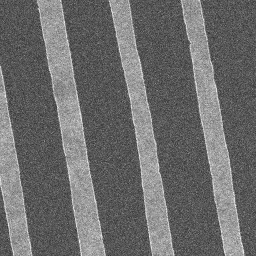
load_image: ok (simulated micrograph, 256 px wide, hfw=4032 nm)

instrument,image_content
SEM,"one or a few lines or trenches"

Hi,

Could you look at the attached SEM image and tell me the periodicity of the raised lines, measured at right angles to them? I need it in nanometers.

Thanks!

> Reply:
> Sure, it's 1100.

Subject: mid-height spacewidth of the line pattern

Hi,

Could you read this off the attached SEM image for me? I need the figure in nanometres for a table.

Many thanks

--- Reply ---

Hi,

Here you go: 780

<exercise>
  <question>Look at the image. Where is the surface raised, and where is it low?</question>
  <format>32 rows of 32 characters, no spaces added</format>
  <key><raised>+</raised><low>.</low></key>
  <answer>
.....+++......++.......++.......
.....+++......++.......++.......
.....+++......++.......++.......
.....+++......+++......+++......
.....+++.......++......+++......
......+++......++.......++......
......+++......++.......++......
......+++......++.......++......
......+++......+++......+++.....
......+++.......++......+++.....
.......++.......++......+++.....
+......+++......++.......++.....
+......+++......++.......++.....
+......+++......+++......++.....
+......+++.......++......+++....
+.......++.......++......+++....
++......++.......++.......++....
++......+++......++.......++....
++......+++......+++......++....
++......+++......+++......+++...
++......+++.......++......+++...
++.......++.......++......+++...
+++......++.......++.......++...
+++......+++......++.......++...
+++......+++......++.......++...
.++......+++......+++......++...
.++......+++......+++......+++..
.++......+++......+++......+++..
.++.......+++......++.......++..
.+++......+++......++.......++..
.+++......+++......++.......++..
..++......+++......+++......++..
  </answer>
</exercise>